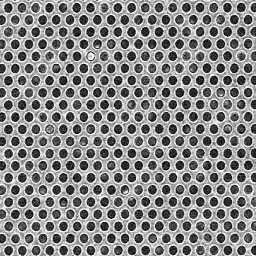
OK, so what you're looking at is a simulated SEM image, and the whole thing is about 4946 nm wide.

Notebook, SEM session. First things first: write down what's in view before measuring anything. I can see a regular array of holes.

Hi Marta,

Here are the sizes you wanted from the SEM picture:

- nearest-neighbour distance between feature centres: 262 nm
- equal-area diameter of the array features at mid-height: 193 nanometers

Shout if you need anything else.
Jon